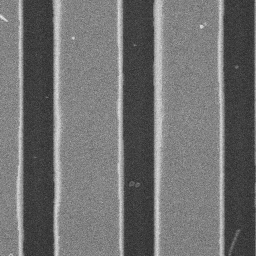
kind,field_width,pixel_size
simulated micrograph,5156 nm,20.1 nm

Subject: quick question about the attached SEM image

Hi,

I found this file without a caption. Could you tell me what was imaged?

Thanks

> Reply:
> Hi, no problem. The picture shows lines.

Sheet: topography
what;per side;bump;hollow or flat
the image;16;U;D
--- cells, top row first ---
UDDUUUUUDDUUUUDD
UDDUUUUUDDUUUUDD
UDDUUUUUDDUUUUDD
UDDUUUUUDDUUUUDD
UDDUUUUUDDUUUUDD
UDDUUUUUDDUUUUDD
UDDUUUUUDDUUUUDD
UDDUUUUUDDUUUUDD
UDDUUUUUDDUUUUDD
UDDUUUUUDDUUUUDD
UDDUUUUUDDUUUUDD
UDDUUUUUDDUUUUDD
UDDUUUUUDDUUUUDD
UDDUUUUUDDUUUUDD
UDDUUUUUDDUUUUDD
UDDUUUUUDDUUUUDD